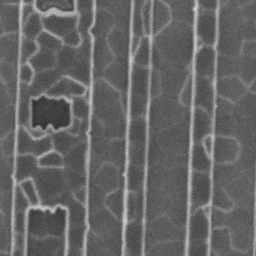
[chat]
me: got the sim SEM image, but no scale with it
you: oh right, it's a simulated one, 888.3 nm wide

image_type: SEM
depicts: one or a few lines or trenches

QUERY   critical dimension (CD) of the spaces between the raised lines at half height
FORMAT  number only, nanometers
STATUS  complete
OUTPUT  136